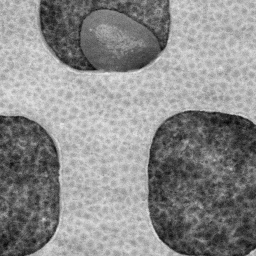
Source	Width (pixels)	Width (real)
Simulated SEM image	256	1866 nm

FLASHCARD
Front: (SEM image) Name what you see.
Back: holes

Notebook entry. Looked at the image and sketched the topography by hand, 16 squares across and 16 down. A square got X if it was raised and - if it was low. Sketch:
XX---------XXXXX
XX---------XXXXX
XXX--------XXXXX
XXX-------XXXXXX
XXXXXX--XXXXXXXX
XXXXXXXXXXXXXXXX
XXXXXXXXXXXXXXXX
--XXXXXXXX------
---XXXXXXX------
----XXXXX-------
----XXXXX-------
----XXXXX-------
----XXXXX-------
----XXXXX-------
---XXXXXXX------
---XXXXXXXX-----